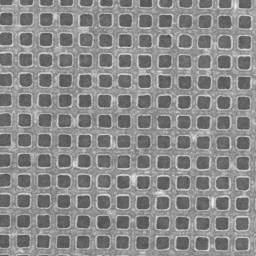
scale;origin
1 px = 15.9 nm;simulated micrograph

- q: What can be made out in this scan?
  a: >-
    a regular array of holes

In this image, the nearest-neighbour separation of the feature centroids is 315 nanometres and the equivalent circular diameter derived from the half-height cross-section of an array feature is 0.233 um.